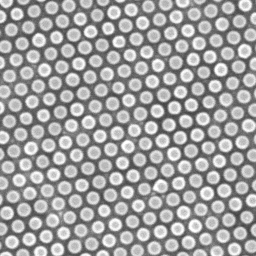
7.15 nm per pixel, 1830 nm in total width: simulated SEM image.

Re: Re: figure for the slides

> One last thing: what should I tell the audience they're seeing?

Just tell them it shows a regular array of raised bodies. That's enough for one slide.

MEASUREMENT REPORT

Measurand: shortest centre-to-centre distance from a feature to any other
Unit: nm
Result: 121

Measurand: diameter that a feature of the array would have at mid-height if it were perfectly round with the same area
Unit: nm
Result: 83.8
